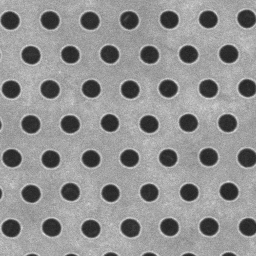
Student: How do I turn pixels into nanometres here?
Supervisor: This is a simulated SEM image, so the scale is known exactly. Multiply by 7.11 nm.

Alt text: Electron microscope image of a regular array of holes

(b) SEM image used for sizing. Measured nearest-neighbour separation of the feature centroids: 277 nanometres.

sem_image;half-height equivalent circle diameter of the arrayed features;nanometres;132